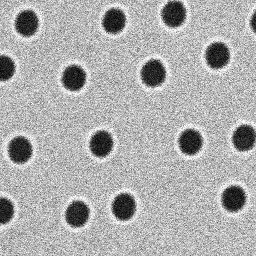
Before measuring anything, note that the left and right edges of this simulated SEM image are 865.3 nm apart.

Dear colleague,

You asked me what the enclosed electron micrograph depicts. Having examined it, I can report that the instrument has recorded a regular array of holes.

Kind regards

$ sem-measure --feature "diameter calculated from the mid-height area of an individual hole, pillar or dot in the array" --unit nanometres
86.6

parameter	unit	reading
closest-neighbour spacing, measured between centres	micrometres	0.226